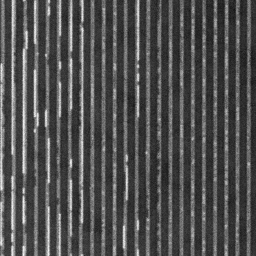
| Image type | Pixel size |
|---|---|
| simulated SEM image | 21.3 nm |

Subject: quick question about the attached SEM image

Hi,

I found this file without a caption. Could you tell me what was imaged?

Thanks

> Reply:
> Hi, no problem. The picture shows parallel lines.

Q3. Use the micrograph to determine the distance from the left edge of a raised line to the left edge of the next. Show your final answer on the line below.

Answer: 11.2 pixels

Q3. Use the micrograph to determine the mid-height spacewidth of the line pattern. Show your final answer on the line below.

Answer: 8.87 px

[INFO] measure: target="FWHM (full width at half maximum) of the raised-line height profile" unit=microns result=0.0479